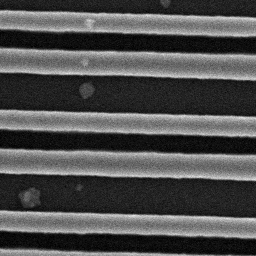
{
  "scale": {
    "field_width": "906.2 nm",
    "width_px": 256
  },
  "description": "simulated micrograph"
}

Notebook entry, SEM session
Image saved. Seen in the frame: lines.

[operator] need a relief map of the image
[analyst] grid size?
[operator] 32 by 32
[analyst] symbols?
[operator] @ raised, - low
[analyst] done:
--------------------------------
@@@@@---------------------------
@@@@@@@@@@@@@@@@@@@@@@@@@@@@@@@@
@@@@@@@@@@@@@@@@@@@@@@@@@@@@@@@@
----------------------------@@@@
--------------------------------
@@@@@@@@@@@@@@@@----------------
@@@@@@@@@@@@@@@@@@@@@@@@@@@@@@@@
@@@@@@@@@@@@@@@@@@@@@@@@@@@@@@@@
------------------@@@@@@@@@@@@@@
--------------------------------
--------------------------------
--------------------------------
--------------------------------
@@@@@@@@@@@@@@@@@@@@@@@@--------
@@@@@@@@@@@@@@@@@@@@@@@@@@@@@@@@
--------------@@@@@@@@@@@@@@@@@@
--------------------------------
--------------------------------
@@@@@@@@@@@@@@@@@@@@@@@@@@@@@@@@
@@@@@@@@@@@@@@@@@@@@@@@@@@@@@@@@
@@@@@@@@@@@@@@@@@@@@@@@@@@@@@@@@
------------------------------@@
--------------------------------
--------------------------------
--------------------------------
@@------------------------------
@@@@@@@@@@@@@@@@@@@@@@@@@@@@@@@@
@@@@@@@@@@@@@@@@@@@@@@@@@@@@@@@@
---------------------------@@@@@
--------------------------------
@@@@@@@@------------------------